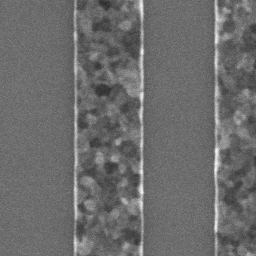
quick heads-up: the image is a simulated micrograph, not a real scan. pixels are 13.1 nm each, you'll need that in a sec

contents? wiring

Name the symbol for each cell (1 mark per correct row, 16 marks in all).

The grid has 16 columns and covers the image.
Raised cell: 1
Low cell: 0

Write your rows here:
0000011110000111
0000011110000111
0000011110000111
0000011110000111
0000011110000111
0000011110000111
0000011110000111
0000011110000111
0000011110000111
0000011110000111
0000011110000111
0000011110000111
0000011110000111
0000011110000111
0000011110000111
0000011110000111